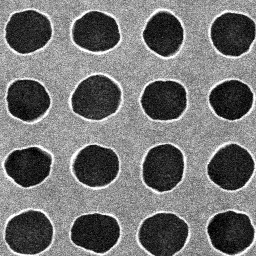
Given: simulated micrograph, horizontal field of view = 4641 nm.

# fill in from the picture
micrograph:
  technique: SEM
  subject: a regular array of holes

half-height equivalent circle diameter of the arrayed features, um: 0.807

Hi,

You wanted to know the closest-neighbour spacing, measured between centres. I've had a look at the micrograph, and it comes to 1200 nanometres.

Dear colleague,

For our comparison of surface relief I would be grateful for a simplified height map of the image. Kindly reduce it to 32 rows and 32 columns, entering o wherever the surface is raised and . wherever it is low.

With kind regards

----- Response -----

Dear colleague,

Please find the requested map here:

oooooooooooooooooooooooooooooooo
oo...oooooo.oooooooo.ooooooooooo
o.....oooo....ooooo...ooooo.....
o.....ooo......ooo.....ooo......
o.....ooo......ooo.....ooo......
o.....oooo.....ooo.....oooo....o
oo..ooooooooooooooo...ooooo....o
oooooooooooooooooooooooooooooooo
oooooooooooooooooooooooooooooooo
ooooooooooo..ooooooooooooooooooo
o....ooooo.....oooo....ooooo...o
o.....ooo......ooo.....ooo.....o
o.....ooo......ooo.....ooo......
o.....ooo......ooo.....oooo....o
oo...ooooo....ooooo...ooooo...oo
oooooooooooooooooooooooooooooooo
oooooooooooooooooooooooooooooooo
oooooooooooooooooooooooooooooooo
ooo..ooooo...oooooo...oooooo..oo
o.....oooo.....ooo.....oooo....o
o.....ooo......ooo.....ooo......
o.....ooo......ooo.....ooo......
oo...ooooo....oooo.....ooo.....o
ooooooooooooooooooo...oooooo..oo
oooooooooooooooooooooooooooooooo
oooooooooooooooooooooooooooooooo
ooo..ooooooooooooooooooooooo.ooo
o.....ooo.....oooo.....ooo.....o
o......oo......oo.......oo......
o......oo......oo......ooo......
o.....ooo.....oooo.....ooo.....o
oo...ooooooo.oooooo...oooooo..oo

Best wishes